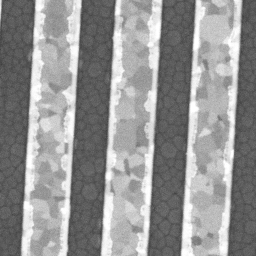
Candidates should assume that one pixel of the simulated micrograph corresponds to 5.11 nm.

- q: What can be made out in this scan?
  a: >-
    one or a few lines or trenches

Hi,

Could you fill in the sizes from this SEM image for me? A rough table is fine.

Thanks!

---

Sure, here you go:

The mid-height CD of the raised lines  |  202 nanometers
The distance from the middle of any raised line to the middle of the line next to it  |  409 nm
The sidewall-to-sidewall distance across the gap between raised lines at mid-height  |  206 nanometres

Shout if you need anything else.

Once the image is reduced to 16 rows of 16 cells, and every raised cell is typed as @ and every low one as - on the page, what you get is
--@@@--@@@--@@@-
--@@@--@@@--@@@-
--@@@--@@@--@@@-
--@@@--@@@--@@@-
--@@@--@@@--@@@-
--@@@--@@@--@@@-
--@@@--@@@--@@@-
--@@---@@---@@--
--@@---@@---@@--
--@@---@@---@@--
--@@---@@---@@--
--@@---@@---@@--
--@@---@@---@@--
--@@---@@---@@--
--@@---@@---@@--
--@@---@@---@@--